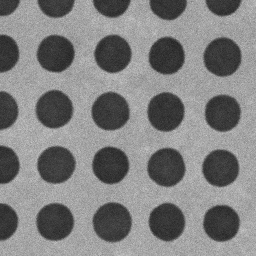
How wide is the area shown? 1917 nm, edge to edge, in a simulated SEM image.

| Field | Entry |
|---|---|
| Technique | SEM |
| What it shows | a regular array of holes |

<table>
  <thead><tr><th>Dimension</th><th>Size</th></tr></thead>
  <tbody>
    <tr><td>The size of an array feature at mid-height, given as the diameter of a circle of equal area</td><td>287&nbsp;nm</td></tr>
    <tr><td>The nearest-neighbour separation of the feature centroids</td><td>407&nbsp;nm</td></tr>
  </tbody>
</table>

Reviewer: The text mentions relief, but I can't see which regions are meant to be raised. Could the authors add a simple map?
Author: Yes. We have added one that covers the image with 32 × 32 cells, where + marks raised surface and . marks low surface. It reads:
..+++....+++....+++....+++....++
..+++....+++....+++....+++...+++
+++++++++++++++++++++.++++++++++
++++++++++++++++++++++++++++++++
.+++++..+++++..+++++++++++++++++
..+++....+++....+++....+++....++
..+++....+++....+++....+++....++
..+++....+++....+++....++.....++
..+++...+++++...+++....+++....++
+++++++++++++++++++++++++++..+++
++++++++++++++++++++++++++++++++
.+++++..+++++.++++++++++++++++++
..+++....+++....+++....+++....++
..++.....++.....++.....+++....++
..++.....++.....++.....+++....++
..+++...++++....+++....+++....++
++++++++++++++++++++++++++++++++
++++++++++++++++++++++++++++++++
.+++++..+++++..+++++++++++++++++
..+++....+++....+++....+++...+++
..+++....++.....++.....++.....++
..+++....+++....++.....++.....++
..+++...++++...++++....+++...+++
++++++++++++++++++++++++++++++++
++++++++++++++++++++++++++++++++
.+++++..+++++..+++++..++++++++++
..+++....+++....+++....+++....++
..+++....+++....+++....++.....++
..+++....+++....+++....++.....++
.++++...++++....+++...++++...+++
++++++++++++++++++++++++++++++++
++++++++++++++++++++++++++++++++